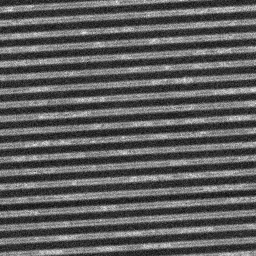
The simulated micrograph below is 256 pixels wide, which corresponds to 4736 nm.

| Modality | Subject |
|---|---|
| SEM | parallel lines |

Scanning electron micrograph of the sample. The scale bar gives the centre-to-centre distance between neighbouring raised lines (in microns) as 0.252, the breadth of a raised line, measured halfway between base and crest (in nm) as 85.4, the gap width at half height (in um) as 0.168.